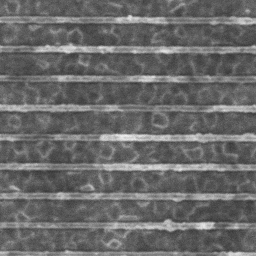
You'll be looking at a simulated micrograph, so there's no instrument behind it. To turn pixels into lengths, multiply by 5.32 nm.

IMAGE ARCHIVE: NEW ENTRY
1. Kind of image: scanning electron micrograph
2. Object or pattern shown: parallel lines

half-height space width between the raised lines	0.128	micrometres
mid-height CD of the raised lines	28.6	nm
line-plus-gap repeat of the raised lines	156	nm